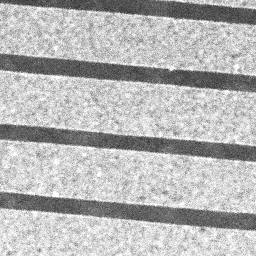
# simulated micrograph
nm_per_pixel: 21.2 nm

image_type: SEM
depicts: one or a few lines or trenches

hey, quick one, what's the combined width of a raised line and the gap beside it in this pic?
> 1450 nm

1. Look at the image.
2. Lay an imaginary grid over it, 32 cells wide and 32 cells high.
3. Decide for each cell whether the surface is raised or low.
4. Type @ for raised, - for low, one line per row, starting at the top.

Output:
--------------------------@@@@@@
@@@@@@@@@@@@--------------------
@@@@@@@@@@@@@@@@@@@@@@----------
@@@@@@@@@@@@@@@@@@@@@@@@@@@@@@@@
@@@@@@@@@@@@@@@@@@@@@@@@@@@@@@@@
@@@@@@@@@@@@@@@@@@@@@@@@@@@@@@@@
@@@@@@@@@@@@@@@@@@@@@@@@@@@@@@@@
-----------@@@@@@@@@@@@@@@@@@@@@
---------------------@@@@@@@@@@@
@@@@@@--------------------------
@@@@@@@@@@@@@@@@@@@-------------
@@@@@@@@@@@@@@@@@@@@@@@@@@@@@@@-
@@@@@@@@@@@@@@@@@@@@@@@@@@@@@@@@
@@@@@@@@@@@@@@@@@@@@@@@@@@@@@@@@
@@@@@@@@@@@@@@@@@@@@@@@@@@@@@@@@
--@@@@@@@@@@@@@@@@@@@@@@@@@@@@@@
-------------@@@@@@@@@@@@@@@@@@@
-------------------------@@@@@@@
@@@@@@@@@@@---------------------
@@@@@@@@@@@@@@@@@@@@@@@---------
@@@@@@@@@@@@@@@@@@@@@@@@@@@@@@@@
@@@@@@@@@@@@@@@@@@@@@@@@@@@@@@@@
@@@@@@@@@@@@@@@@@@@@@@@@@@@@@@@@
@@@@@@@@@@@@@@@@@@@@@@@@@@@@@@@@
-------@@@@@@@@@@@@@@@@@@@@@@@@@
------------------@@@@@@@@@@@@@@
@@@@---------------------------@
@@@@@@@@@@@@@@@-----------------
@@@@@@@@@@@@@@@@@@@@@@@@@@------
@@@@@@@@@@@@@@@@@@@@@@@@@@@@@@@@
@@@@@@@@@@@@@@@@@@@@@@@@@@@@@@@@
@@@@@@@@@@@@@@@@@@@@@@@@@@@@@@@@